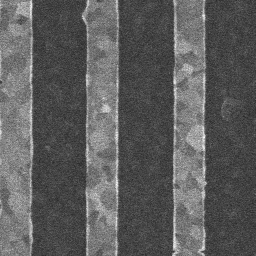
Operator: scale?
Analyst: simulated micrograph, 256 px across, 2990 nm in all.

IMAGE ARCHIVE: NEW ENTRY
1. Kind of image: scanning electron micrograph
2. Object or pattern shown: one or a few lines or trenches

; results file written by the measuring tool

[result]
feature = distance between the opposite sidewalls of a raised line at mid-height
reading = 0.349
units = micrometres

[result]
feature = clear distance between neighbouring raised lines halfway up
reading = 0.664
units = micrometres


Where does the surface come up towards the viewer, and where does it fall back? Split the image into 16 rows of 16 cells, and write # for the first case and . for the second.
##...##....##...
##...##....##...
##...##....##...
##...##....##...
##...##....##...
##...##....##...
##...##....##...
##...##....##...
##...##....##...
##...##....##...
##...##....##...
##...##....##...
##...##....##...
##...##....##...
##...##....##...
##...##....##...